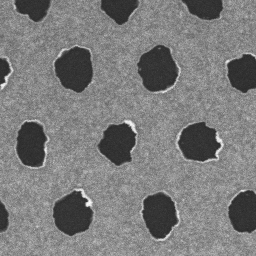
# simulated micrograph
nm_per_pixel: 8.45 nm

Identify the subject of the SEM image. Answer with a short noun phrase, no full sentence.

holes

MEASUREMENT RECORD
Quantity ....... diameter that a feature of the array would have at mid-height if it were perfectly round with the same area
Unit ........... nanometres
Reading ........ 336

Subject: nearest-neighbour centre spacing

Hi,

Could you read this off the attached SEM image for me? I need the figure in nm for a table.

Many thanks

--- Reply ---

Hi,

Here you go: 685